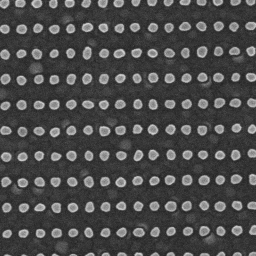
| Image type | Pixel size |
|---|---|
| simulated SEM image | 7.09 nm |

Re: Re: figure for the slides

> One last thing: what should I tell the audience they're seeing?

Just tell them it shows a regular array of raised bodies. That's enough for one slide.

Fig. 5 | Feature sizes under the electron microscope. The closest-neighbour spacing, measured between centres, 113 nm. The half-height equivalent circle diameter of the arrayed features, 0.0674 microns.